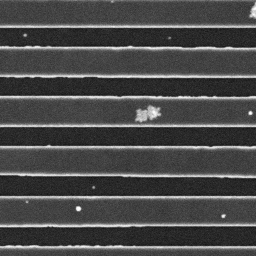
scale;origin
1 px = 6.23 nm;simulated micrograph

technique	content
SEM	lines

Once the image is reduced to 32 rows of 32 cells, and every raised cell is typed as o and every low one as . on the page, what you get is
oooooooooooooooooooooooooooooooo
oooooooooooooooooooooooooooooooo
oooooooooooooooooooooooooooooooo
................................
................................
................................
oooooooooooooooooooooooooooooooo
oooooooooooooooooooooooooooooooo
oooooooooooooooooooooooooooooooo
oooooooooooooooooooooooooooooooo
................................
................................
oooooooooooooooooooooooooooooooo
oooooooooooooooooooooooooooooooo
oooooooooooooooooooooooooooooooo
oooooooooooooooooooooooooooooooo
................................
................................
oooooooooooooooooooooooooooooooo
oooooooooooooooooooooooooooooooo
oooooooooooooooooooooooooooooooo
oooooooooooooooooooooooooooooooo
................................
................................
................................
oooooooooooooooooooooooooooooooo
oooooooooooooooooooooooooooooooo
oooooooooooooooooooooooooooooooo
................................
................................
................................
oooooooooooooooooooooooooooooooo